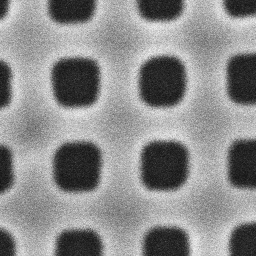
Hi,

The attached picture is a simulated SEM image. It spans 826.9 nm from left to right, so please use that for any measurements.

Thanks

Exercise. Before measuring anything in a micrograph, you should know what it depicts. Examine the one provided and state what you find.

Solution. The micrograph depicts holes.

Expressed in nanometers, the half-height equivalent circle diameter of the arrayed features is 179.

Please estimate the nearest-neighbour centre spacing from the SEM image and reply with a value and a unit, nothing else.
0.271 micrometres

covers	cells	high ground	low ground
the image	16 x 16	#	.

.##...##....##..
####.###########
################
##########.####.
.##...###...##..
.##...###...##..
.###..###..####.
################
################
.##...###...##..
.##...###...##..
.##...###...##..
################
################
.###..###...##..
.##...###...##..